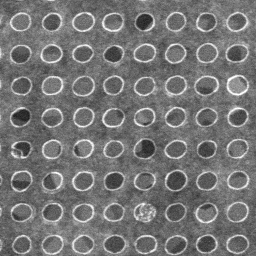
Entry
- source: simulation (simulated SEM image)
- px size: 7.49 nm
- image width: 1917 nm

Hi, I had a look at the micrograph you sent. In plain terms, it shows a regular array of raised bodies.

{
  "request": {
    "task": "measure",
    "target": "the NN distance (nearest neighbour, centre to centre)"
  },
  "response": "230 nm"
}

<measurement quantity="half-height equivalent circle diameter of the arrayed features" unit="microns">0.146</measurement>